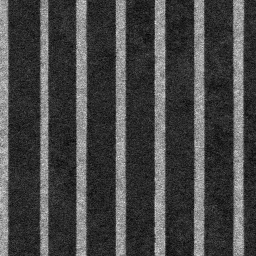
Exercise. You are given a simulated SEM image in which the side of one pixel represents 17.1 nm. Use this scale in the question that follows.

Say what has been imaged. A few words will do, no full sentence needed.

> parallel lines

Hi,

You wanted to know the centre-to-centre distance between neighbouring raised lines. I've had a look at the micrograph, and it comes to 662 nm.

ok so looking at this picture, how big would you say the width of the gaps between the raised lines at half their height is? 510 nm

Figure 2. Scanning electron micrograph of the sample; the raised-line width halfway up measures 156 nanometres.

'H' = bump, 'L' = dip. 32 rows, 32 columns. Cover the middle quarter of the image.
LLLHHLLLLLLLLHHLLLLLLLLHHLLLLLLL
LLLHHLLLLLLLLHHLLLLLLLLHHLLLLLLL
LLLHHLLLLLLLLHHLLLLLLLLHHLLLLLLL
LLLHHHLLLLLLLHHLLLLLLLLHHLLLLLLL
LLLHHHLLLLLLLHHLLLLLLLLHHLLLLLLL
LLLHHHLLLLLLLHHLLLLLLLLHHLLLLLLL
LLLHHHLLLLLLLHHLLLLLLLLHHLLLLLLL
LLLHHLLLLLLLLHHLLLLLLLLHHLLLLLLL
LLLHHLLLLLLLLHHLLLLLLLLHHLLLLLLL
LLLHHLLLLLLLLHHLLLLLLLLHHLLLLLLL
LLLHHLLLLLLLLHHLLLLLLLLHHLLLLLLL
LLLHHLLLLLLLLHHLLLLLLLLHHLLLLLLL
LLLHHLLLLLLLLHHLLLLLLLLHHLLLLLLL
LLLHHLLLLLLLLHHLLLLLLLLHHLLLLLLL
LLLHHLLLLLLLLHHLLLLLLLLHHLLLLLLL
LLLHHLLLLLLLLHHLLLLLLLLHHLLLLLLL
LLLHHLLLLLLLLHHLLLLLLLLHHLLLLLLL
LLLHHLLLLLLLLHHLLLLLLLLHHLLLLLLL
LLLHHLLLLLLLLHHLLLLLLLLHHLLLLLLL
LLLHHLLLLLLLLHHLLLLLLLLHHLLLLLLL
LLLHHLLLLLLLLHHLLLLLLLLHHLLLLLLL
LLLHHLLLLLLLLHHLLLLLLLLHHLLLLLLL
LLLHHLLLLLLLLHHLLLLLLLLHHLLLLLLL
LLLHHLLLLLLLLHHLLLLLLLLHHLLLLLLL
LLLHHLLLLLLLLHHLLLLLLLLHHLLLLLLL
LLLHHLLLLLLLLHHLLLLLLLLHHLLLLLLL
LLLHHLLLLLLLLHHLLLLLLLLHHLLLLLLL
LLLHHLLLLLLLLHHLLLLLLLLHHLLLLLLL
LLLHHLLLLLLLLHHLLLLLLLLHHLLLLLLL
LLLHHLLLLLLLLHHLLLLLLLLHHLLLLLLL
LLLHHLLLLLLLLHHLLLLLLLLHHLLLLLLL
LLLHHLLLLLLLLHHLLLLLLLLHHLLLLLLL